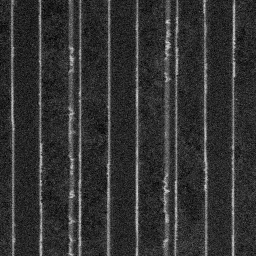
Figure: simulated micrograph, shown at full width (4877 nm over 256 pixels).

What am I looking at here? lines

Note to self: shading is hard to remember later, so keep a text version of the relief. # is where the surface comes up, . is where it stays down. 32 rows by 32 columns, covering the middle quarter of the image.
..##.......#######........##....
..##.......#######........##....
..##.......#######........##....
..##.......#######........##....
..##.......#######........##....
..##.......#######........##....
..##.......#######........##....
..##.......#######........##....
..##.......#######........##....
..##.......#######........##....
..##.......#######........##....
..##.......#######........##....
..##.......#######........##....
..##.......#######........##....
..##.......#######........##....
..##.......#######........##....
..##.......#######........##....
..##.......#######........##....
..##.......#######........##....
..##.......#######........##....
..##.......#######........##....
..##.......#######........##....
..##.......#######........##....
..##.......#######........##....
..##.......#######........##....
..##.......#######........##....
..##.......#######........##....
..##.......#######........##....
..##.......#######........##....
..##.......#######........##....
..##.......#######........##....
..##.......#######........##....